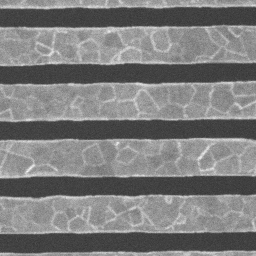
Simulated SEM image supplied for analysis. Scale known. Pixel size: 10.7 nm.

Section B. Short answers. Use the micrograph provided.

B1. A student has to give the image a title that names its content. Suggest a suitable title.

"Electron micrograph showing wiring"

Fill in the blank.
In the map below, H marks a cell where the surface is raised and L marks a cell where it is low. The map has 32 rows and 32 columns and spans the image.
HHHHHHHHHHHHHHHHHHHHHHHHHHHHHHLH
LLLLLLLLLLLLLLLLLLLLLLLLLLLLLLLL
LLLLLLLLLLLLLLLLLLLLLLLLLLLLLLLL
LLLLLLLLLLLLLLLLHHLLLHHLHHHHHHHH
HHHHHHHHHHHHHHHHHHHHHHHHHHHHHHHH
HHHHHHHHHHHHHHHHHHHHHHHHHHHHHHHH
HHHHHHHHHHHHHHHHHHHHHHHHHHHHHHHH
HHHHHHHHHHHHHHHHHHHHHHHHHHHHHHHH
LLLLLLLLLLLLLLLLLLLLLLLLLLLLLLLL
LLLLLLLLLLLLLLLLLLLLLLLLLLLLLLLL
LLLLLLLLLLLLHHHHHLLLLLLHHHHHHHHH
HHHHHHHHHHHHHHHHHHHHHHHHHHHHHHHH
HHHHHHHHHHHHHHHHHHHHHHHHHHHHHHHH
HHHHHHHHHHHHHHHHHHHHHHHHHHHHHHHH
HHHHHHHHHHHHHHHHHHHHHHHHHHHHHHHH
LLLLLLLLLLLLLLLLLLLLLLLLLLLLLLLL
LLLLLLLLLLLLLLLLLLLLLLLLLLLLLLLL
LLLLLLLLHHLLLLHHHHLLLHHHHHHLLLLL
HHHHHHHHHHHHHHHHHHHHHHHHHHHHHHHH
HHHHHHHHHHHHHHHHHHHHHHHHHHHHHHHH
HHHHHHHHHHHHHHHHHHHHHHHHHHHHHHHH
HHHHHHHHHHHHHHHHHHHHHHHHHHHHHHHH
LLLLLLLLLLLLLLLLLLLLLLLLLLLLLLLL
LLLLLLLLLLLLLLLLLLLLLLLLLLLLLLLL
LLLLLLLLLLLLLLLLLLLLLLLLLLLLLLLL
HHHHHHHHHHHHHHHHHHHHHHHHHHHHHHHH
HHHHHHHHHHHHHHHHHHHHHHHHHHHHHHHH
HHHHHHHHHHHHHHHHHHHHHHHHHHHHHHHH
HHHHHHHHHHHHHHHHHHHHHHHHHHHHHHHH
LLLLLLLLLLLLLLLLLLLLLLLLLLLLLLLL
LLLLLLLLLLLLLLLLLLLLLLLLLLLLLLLL
LLLLLLLLLLLLLLLLLLLLLLLLLLLLHHHL